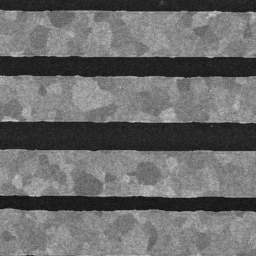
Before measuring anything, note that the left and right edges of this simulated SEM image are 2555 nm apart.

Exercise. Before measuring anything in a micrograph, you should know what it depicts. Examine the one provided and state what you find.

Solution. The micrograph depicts lines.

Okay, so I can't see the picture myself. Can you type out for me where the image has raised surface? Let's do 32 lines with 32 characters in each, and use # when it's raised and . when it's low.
................................
###..###########......##........
################################
################################
################################
################################
################################
................................
................................
..##...#.#......................
################################
################################
################################
################################
################################
................................
................................
................................
................................
################################
################################
################################
################################
################################
....................#####...####
................................
################################
################################
################################
################################
################################
################################